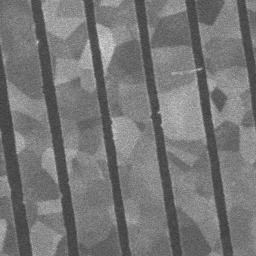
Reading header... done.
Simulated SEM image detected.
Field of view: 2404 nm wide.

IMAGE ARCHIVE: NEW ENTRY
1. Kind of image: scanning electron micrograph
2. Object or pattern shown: parallel lines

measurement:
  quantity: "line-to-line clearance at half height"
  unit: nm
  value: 98.7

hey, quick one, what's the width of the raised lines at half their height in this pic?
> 371 nanometers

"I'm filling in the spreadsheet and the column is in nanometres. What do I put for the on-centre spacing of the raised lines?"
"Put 472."